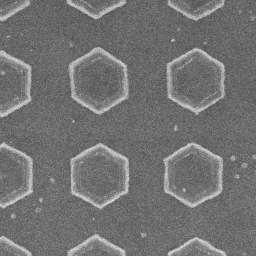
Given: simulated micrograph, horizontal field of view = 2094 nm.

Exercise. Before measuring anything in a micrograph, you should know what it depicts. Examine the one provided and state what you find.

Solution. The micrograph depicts raised bodies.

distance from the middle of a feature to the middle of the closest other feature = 772 nanometers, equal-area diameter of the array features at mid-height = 465 nm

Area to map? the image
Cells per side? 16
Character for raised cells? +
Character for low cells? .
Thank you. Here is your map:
+....++....++...
................
................
.....++....++...
++...+++...+++..
++...+++...+++..
+....++....++...
................
................
+....++....++...
++...+++..++++..
++...+++..++++..
+.....+....++...
................
................
+....++....++...